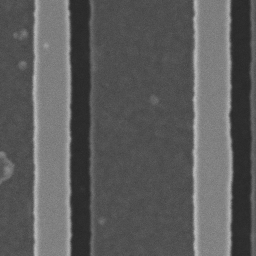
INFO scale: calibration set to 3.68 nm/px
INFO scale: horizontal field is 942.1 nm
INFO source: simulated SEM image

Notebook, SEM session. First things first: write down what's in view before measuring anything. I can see lines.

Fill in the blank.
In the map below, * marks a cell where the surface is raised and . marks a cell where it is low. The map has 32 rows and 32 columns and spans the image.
*********..******************..*
*********..******************..*
*********..******************..*
*********..******************...
*********..******************...
*********..******************..*
*********..******************...
*********..******************...
*********..******************..*
*********..******************..*
*********..******************...
*********..******************..*
*********..******************..*
*********..******************..*
*********..******************..*
*********..******************..*
*********..******************..*
*********..******************...
*********..******************...
*********..******************..*
*********..******************...
*********..******************..*
*********..******************...
*********..******************...
*********..******************..*
*********..******************..*
*********..******************...
*********..******************...
*********..******************...
*********..******************..*
*********..******************..*
*********..******************...